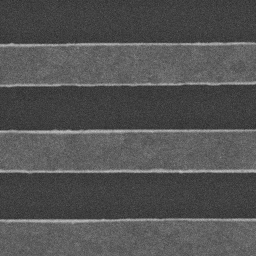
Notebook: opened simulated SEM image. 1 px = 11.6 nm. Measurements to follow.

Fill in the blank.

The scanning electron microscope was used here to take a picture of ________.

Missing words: lines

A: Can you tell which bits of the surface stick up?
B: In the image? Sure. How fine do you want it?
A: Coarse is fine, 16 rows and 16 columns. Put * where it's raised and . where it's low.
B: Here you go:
................
................
................
****************
****************
................
................
................
****************
****************
****************
................
................
................
****************
****************